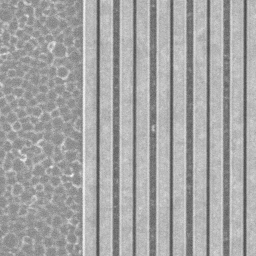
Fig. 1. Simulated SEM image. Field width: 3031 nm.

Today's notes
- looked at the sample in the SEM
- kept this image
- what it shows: parallel lines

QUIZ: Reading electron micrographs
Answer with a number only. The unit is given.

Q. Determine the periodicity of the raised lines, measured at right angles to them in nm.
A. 218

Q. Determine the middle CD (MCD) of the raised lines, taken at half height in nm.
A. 135